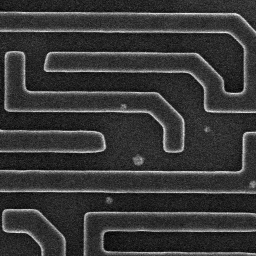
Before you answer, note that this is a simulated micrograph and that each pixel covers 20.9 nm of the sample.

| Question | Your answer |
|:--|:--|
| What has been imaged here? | wiring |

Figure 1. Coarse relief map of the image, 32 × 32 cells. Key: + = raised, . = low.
................................
................................
+++++++++++++++++++++++++++++++.
++++++++++++++++++++++++++++++++
.............................+++
..............................++
.++............................+
.++...++++++++++++++++++++.....+
.++...+++++++++++++++++++++....+
.++.....................++++...+
.++......................+++...+
.+++.....................+++..++
.++++++++++++++++++++.....++++++
.+++++++++++++++++++++....++++++
...................++++.........
....................+++.........
++++++++++++........+++.........
+++++++++++++.......+++.......++
+++++++++++++........++.......++
..............................++
..............................++
+++++++++++++++++++++........+++
++++++++++++++++++++++++++++++++
++++++++++++++++++++++++++++++++
................................
................................
.++++...........................
++++++.....+++++++++++++++++++++
+++++++....+++++++++++++++++++++
....++++...++...................
.....+++...++...................
.....+++...+++..................